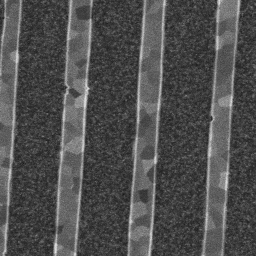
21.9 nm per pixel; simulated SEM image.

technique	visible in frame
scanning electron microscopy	one or a few lines or trenches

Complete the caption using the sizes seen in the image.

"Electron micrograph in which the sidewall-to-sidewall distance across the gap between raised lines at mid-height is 1.15 um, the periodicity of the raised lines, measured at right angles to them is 1600 nm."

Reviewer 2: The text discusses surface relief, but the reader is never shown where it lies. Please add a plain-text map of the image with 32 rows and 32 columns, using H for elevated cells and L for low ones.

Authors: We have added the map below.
LHHLLLLLLHHLLLLLLLHHHLLLLLLHHHLL
LHLLLLLLLHHLLLLLLLHHLLLLLLLHHHLL
LHLLLLLLLHHLLLLLLLHHLLLLLLLHHHLL
LHLLLLLLLHHLLLLLLLHHLLLLLLLHHHLL
HHLLLLLLHHHLLLLLLLHHLLLLLLLHHHLL
HHLLLLLLHHHLLLLLLLHHLLLLLLLHHLLL
HHLLLLLLHHHLLLLLLLHHLLLLLLLHHLLL
HHLLLLLLHHHLLLLLLLHHLLLLLLLHHLLL
HHLLLLLLHHHLLLLLLHHHLLLLLLLHHLLL
HHLLLLLLHHHLLLLLLHHHLLLLLLLHHLLL
HHLLLLLLHHHLLLLLLHHHLLLLLLLHHLLL
HHLLLLLLHHHLLLLLLHHHLLLLLLLHHLLL
HHLLLLLLHHHLLLLLLHHHLLLLLLLHHLLL
HHLLLLLLHHHLLLLLLHHHLLLLLLLHHLLL
HHLLLLLLHHHLLLLLLHHHLLLLLLLHHLLL
HHLLLLLLHHLLLLLLLHHHLLLLLLHHHLLL
HHLLLLLLHHLLLLLLLHHHLLLLLLHHHLLL
HHLLLLLLHHLLLLLLLHHLLLLLLLHHHLLL
HLLLLLLLHHLLLLLLLHHLLLLLLLHHHLLL
HLLLLLLLHHLLLLLLLHHLLLLLLLHHLLLL
HLLLLLLLHHLLLLLLLHHLLLLLLLHHLLLL
HLLLLLLLHHLLLLLLLHHLLLLLLLHHLLLL
HLLLLLLHHHLLLLLLLHHLLLLLLLHHLLLL
HLLLLLLHHHLLLLLLLHHLLLLLLLHHLLLL
HLLLLLLHHHLLLLLLLHHLLLLLLLHHLLLL
HLLLLLLHHHLLLLLLHHHLLLLLLLHHLLLL
HLLLLLLHHHLLLLLLHHHLLLLLLLHHLLLL
HLLLLLLHHHLLLLLLHHHLLLLLLLHHLLLL
HLLLLLLHHHLLLLLLHHHLLLLLLLHHLLLL
HLLLLLLHHHLLLLLLHHHLLLLLLLHHLLLL
HLLLLLLHHLLLLLLLHHHLLLLLLLHHLLLL
HLLLLLLHHLLLLLLLHHHLLLLLLHHHLLLL